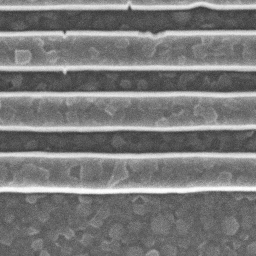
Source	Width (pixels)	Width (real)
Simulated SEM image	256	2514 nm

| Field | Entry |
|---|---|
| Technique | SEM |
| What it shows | one or a few lines or trenches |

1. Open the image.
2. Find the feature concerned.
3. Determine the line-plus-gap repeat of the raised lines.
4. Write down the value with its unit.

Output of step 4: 598 nm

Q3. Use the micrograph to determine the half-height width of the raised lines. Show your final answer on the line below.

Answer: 349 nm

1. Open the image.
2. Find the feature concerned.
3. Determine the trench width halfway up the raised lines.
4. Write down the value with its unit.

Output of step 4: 248 nm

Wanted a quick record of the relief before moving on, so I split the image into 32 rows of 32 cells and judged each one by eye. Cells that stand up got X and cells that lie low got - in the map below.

XXXXXXXXXXXXXXXXXXXXXXXXXXXXXXXX
--------------------------------
--------------------------------
--------------------------------
XXXXXXXXXXXXXXXXXXX-XXXXXXXXXXXX
XXXXXXXXXXXXXXXXXXXXXXXXXXXXXXXX
XXXXXXXXXXXXXXXXXXXXXXXXXXXXXXXX
XXXXXXXXXXXXXXXXXXXXXXXXXXXXXXXX
XXXXXXXXX----XXXXXXXXXXX------XX
--------------------------------
--------------------------------
--------------------------------
XXXXXXXXXXXXXXXXXXXXXXXXXXXXXXXX
XXXXXXXXXXXXXXXXXXXXXXXXXXXXXXXX
XXXXXXXXXXXXXXXXXXXXXXXXXXXXXXXX
XXXXXXXXXXXXXXXXXXXXXXXXXXXXXXXX
--------------------------------
--------------------------------
--------------------------------
XXXXXXXXXXXXXX------XXXXXXXXXXXX
XXXXXXXXXXXXXXXXXXXXXXXXXXXXXXXX
XXXXXXXXXXXXXXXXXXXXXXXXXXXXXXXX
XXXXXXXXXXXXXXXXXXXXXXXXXXXXXXXX
XXXXXXXXXXXXXXXXXXXXXXXXXXXXXXXX
--------------------------------
--------------------------------
--------------------------------
--------------------------------
--------------------------------
--------------------------------
--------------------------------
--------------------------------